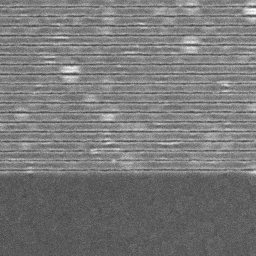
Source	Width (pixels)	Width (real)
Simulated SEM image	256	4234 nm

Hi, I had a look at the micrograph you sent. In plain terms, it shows parallel lines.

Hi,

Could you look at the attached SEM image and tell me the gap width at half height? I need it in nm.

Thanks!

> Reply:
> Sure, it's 35.1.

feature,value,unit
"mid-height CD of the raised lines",124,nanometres